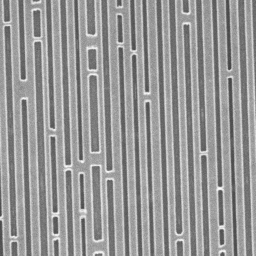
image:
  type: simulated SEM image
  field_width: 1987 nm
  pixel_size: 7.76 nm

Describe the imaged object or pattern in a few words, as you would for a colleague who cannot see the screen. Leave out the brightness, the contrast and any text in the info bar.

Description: parallel lines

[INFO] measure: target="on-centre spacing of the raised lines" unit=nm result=107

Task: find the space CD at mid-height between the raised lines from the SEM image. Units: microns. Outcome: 0.0465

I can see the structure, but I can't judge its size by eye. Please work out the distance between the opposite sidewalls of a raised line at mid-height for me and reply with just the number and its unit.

60.1 nm